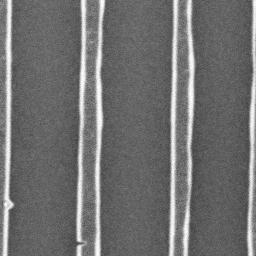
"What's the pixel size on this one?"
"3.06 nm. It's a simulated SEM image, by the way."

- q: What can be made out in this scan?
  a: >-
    one or a few lines or trenches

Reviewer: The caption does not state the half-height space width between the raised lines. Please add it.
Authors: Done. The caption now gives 221 nm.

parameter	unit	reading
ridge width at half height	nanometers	54.7